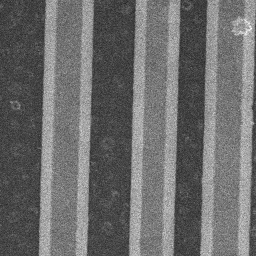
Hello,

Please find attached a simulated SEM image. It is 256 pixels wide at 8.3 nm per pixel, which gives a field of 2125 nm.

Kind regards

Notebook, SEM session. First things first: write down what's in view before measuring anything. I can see one or a few lines or trenches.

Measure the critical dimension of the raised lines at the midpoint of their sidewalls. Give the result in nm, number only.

290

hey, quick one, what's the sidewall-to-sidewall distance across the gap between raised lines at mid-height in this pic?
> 396 nanometres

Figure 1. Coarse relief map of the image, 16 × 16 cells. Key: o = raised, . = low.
...oo....oo..ooo
...oo....oo..ooo
...oo....oo..oo.
...oo....oo..oo.
...oo....oo..oo.
...oo....oo..oo.
...oo....oo..oo.
...oo....oo..oo.
...oo....oo..oo.
...oo....oo..oo.
...oo....oo..oo.
...oo....oo..oo.
...oo....oo..oo.
...oo....oo..oo.
...oo....o...oo.
...oo...oo...oo.